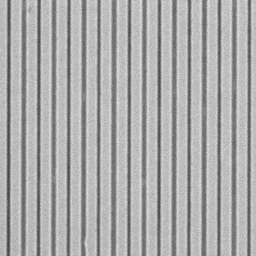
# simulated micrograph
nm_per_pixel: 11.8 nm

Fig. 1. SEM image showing parallel lines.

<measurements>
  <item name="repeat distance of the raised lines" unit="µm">0.179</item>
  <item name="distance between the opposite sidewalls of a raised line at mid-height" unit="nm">118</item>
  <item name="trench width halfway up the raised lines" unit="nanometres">53.3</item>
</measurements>